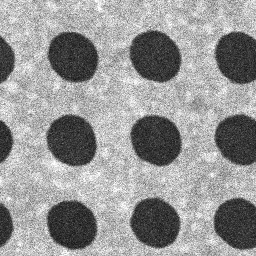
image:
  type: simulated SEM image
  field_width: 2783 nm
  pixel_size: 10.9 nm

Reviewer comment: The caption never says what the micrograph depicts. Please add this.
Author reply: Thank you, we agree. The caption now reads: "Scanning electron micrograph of holes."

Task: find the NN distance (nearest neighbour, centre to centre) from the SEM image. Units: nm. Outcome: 899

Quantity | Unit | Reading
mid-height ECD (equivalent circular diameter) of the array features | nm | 553